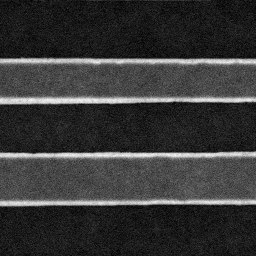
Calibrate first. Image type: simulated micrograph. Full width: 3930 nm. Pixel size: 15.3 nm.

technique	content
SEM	lines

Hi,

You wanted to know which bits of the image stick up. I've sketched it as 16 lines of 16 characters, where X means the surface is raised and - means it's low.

----------------
----------------
----------------
----------------
XXXXXXXXXXXXXXXX
XXXXXXXXXXXXXXXX
----------------
----------------
----------------
----------------
XXXXXXXXXXXXXXXX
XXXXXXXXXXXXXXXX
XXXXXXXXXXXXXXXX
----------------
----------------
----------------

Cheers